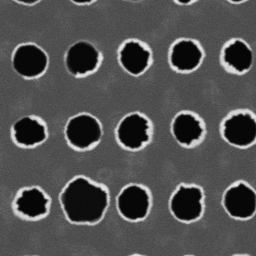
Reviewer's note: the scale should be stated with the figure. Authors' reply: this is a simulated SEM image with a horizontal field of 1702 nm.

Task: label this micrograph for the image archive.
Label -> a regular array of holes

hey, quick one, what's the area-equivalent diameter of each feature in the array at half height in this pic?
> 200 nm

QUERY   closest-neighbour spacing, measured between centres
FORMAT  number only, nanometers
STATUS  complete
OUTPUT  351